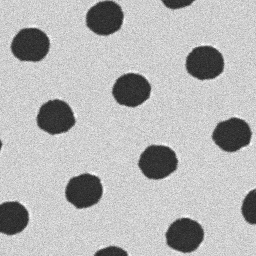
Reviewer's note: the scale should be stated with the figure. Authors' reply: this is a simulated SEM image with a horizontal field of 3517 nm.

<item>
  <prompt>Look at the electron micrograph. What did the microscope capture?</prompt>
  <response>a regular array of holes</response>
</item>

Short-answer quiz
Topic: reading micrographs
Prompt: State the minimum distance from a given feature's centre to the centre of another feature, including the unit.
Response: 76.7 pixels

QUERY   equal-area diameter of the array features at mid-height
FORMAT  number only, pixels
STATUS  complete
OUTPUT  36.7